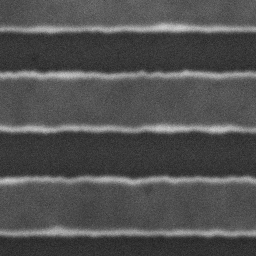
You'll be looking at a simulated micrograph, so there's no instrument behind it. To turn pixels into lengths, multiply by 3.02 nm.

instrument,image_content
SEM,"lines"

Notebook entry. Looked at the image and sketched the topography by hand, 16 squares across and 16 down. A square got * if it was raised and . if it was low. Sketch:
****************
****************
................
................
................
****************
****************
****************
................
................
................
****************
****************
****************
****************
................